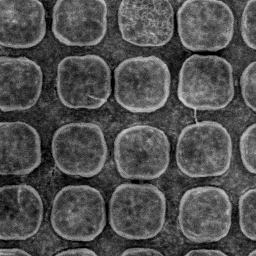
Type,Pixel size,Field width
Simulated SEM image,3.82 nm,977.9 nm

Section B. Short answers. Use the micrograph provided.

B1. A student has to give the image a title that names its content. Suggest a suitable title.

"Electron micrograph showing a regular array of raised bodies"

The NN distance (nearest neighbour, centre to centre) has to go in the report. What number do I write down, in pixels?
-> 59.1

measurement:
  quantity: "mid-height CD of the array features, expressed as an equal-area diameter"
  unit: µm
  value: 0.21